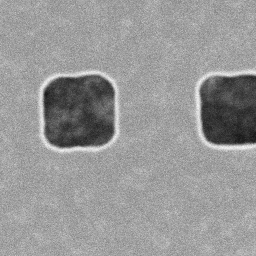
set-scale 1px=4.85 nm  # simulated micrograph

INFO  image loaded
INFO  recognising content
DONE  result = holes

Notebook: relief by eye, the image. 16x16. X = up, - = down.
XXXXXXXXXXXXXXXX
XXXXXXXXXXXXXXXX
XXXXXXXXXXXXXXXX
XXXXXXXXXXXXXXXX
XXXXXXXXXXXXXXXX
XXX----XXXXXX---
XXX----XXXXXX---
XXX----XXXXXX---
XXX----XXXXXX---
XXXXXXXXXXXXXXXX
XXXXXXXXXXXXXXXX
XXXXXXXXXXXXXXXX
XXXXXXXXXXXXXXXX
XXXXXXXXXXXXXXXX
XXXXXXXXXXXXXXXX
XXXXXXXXXXXXXXXX